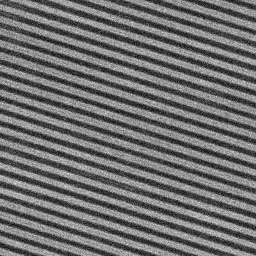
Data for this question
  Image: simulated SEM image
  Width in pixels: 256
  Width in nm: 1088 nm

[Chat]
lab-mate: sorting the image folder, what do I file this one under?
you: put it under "parallel lines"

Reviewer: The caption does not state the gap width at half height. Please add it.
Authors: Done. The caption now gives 24.8 nanometres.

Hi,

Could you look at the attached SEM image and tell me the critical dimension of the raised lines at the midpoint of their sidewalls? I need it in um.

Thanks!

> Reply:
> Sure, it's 0.0248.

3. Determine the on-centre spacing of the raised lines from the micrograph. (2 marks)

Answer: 49.5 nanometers